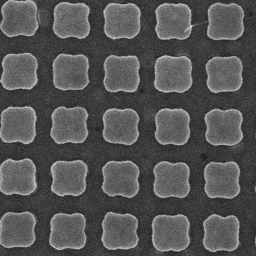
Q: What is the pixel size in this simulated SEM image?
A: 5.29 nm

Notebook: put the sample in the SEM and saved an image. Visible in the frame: a regular array of raised bodies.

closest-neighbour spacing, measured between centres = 271 nanometres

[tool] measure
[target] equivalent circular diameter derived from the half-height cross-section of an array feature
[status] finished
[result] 204 nm